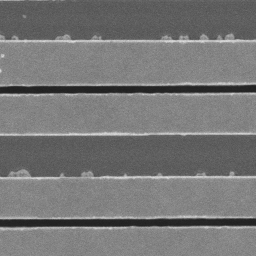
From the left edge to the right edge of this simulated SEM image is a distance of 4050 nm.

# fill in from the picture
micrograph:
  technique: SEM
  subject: lines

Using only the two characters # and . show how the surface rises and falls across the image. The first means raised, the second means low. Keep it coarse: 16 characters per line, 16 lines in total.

................
................
..............#.
################
################
##..############
################
################
................
................
................
################
################
################
################
################